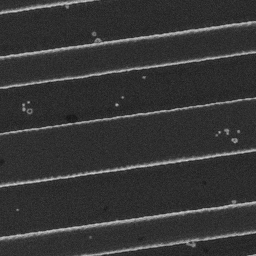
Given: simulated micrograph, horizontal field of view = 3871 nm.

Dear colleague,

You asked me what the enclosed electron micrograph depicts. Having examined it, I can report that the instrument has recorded lines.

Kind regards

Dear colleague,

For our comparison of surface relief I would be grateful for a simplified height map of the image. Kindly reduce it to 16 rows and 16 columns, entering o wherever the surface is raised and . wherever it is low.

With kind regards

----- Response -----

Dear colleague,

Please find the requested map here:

oo..............
...............o
.......ooooooooo
oooooooooooooo..
ooooooo.........
................
.............ooo
......oooooooooo
oooooooooooooooo
ooooooooooooooo.
oooooooo........
o...............
................
..........oooooo
...ooooooooooooo
ooooooooo.......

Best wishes